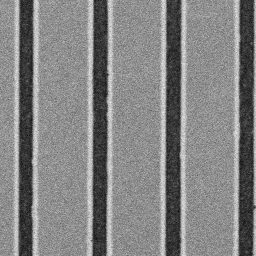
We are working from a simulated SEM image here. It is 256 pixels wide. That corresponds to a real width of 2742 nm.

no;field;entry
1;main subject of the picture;one or a few lines or trenches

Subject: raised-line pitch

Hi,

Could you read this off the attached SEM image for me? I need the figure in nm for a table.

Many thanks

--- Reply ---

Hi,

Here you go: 788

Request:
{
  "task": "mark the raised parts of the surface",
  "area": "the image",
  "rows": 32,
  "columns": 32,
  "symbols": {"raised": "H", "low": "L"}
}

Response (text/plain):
HHLLLHHHHHHLLLHHHHHHHLLHHHHHHHLL
HHLLLHHHHHHLLLHHHHHHHLLHHHHHHHLL
HHLLLHHHHHHLLLHHHHHHLLLHHHHHHHLL
HHLLLHHHHHHLLLHHHHHHLLLHHHHHHHLL
HHLLLHHHHHHLLLHHHHHHLLLHHHHHHHLL
HHLLLHHHHHHLLLHHHHHHLLLHHHHHHHLL
HHLLLHHHHHHLLLHHHHHHLLLHHHHHHHLL
HHLLLHHHHHHLLLHHHHHHLLLHHHHHHHLL
HHLLLHHHHHHLLLHHHHHHLLLHHHHHHHLL
HHLLLHHHHHHLLLHHHHHHLLLHHHHHHHLL
HHLLLHHHHHHLLLHHHHHHLLLHHHHHHHLL
HHLLLHHHHHHLLLHHHHHHLLLHHHHHHHLL
HHLLLHHHHHHLLLHHHHHHLLLHHHHHHHLL
HHLLLHHHHHHLLLHHHHHHLLLHHHHHHHLL
HHLLLHHHHHHLLLHHHHHHLLLHHHHHHHLL
HHLLLHHHHHHLLLHHHHHHLLLHHHHHHHLL
HHLLLHHHHHHLLLHHHHHHLLLHHHHHHHLL
HHLLLHHHHHHLLLHHHHHHLLLHHHHHHHLL
HHLLLHHHHHHLLLHHHHHHLLLHHHHHHHLL
HHLLHHHHHHHLLLHHHHHHLLLHHHHHHHLL
HHLLHHHHHHHLLLHHHHHHLLLHHHHHHHLL
HHLLHHHHHHHLLLHHHHHHLLLHHHHHHHLL
HHLLHHHHHHHLLLHHHHHHLLLHHHHHHHLL
HHLLHHHHHHHLLLHHHHHHLLLHHHHHHHLL
HHLLHHHHHHHLLLHHHHHHLLLHHHHHHHLL
HHLLHHHHHHHLLLHHHHHHLLLHHHHHHHLL
HHLLHHHHHHHLLLHHHHHHLLLHHHHHHHLL
HHLLHHHHHHHLLLHHHHHHLLLHHHHHHHLL
HHLLHHHHHHHLLLHHHHHHLLLHHHHHHHLL
HHLLHHHHHHHLLLHHHHHHLLLHHHHHHHLL
HHLLHHHHHHHLLLHHHHHHLLLHHHHHHHLL
HHLLHHHHHHHLLLHHHHHHLLLHHHHHHHLL